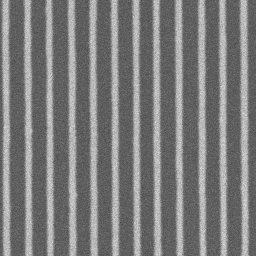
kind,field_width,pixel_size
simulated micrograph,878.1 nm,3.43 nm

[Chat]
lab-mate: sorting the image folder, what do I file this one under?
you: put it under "parallel lines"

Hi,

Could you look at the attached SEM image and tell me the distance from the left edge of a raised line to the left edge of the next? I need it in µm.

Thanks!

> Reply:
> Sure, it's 0.0742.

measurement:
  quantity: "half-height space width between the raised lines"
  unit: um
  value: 0.0544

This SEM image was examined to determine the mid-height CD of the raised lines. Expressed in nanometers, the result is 20.1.